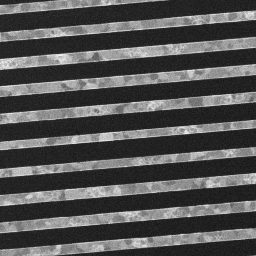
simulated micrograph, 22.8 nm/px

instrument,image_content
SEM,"parallel lines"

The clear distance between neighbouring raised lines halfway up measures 0.404 micrometres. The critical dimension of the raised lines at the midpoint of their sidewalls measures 219 nm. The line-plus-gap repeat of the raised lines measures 620 nm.